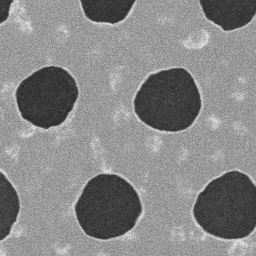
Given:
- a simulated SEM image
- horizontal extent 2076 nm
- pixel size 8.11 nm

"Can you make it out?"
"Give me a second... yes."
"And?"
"holes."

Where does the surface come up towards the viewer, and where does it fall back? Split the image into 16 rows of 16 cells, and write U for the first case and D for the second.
DUUUUDDDUUUUUDDD
UUUUUUUUUUUUUDDU
UUUUUUUUUUUUUUUU
UUUUUUUUUUUUUUUU
UUDDUUUUUUDDUUUU
UDDDDUUUUDDDUUUU
UDDDDUUUDDDDDUUU
UUDDUUUUUDDDUUUU
UUUUUUUUUUUUUUUU
UUUUUUUUUUUUUUUU
UUUUUUUUUUUUUUUU
DUUUUDDDUUUUUDDD
DUUUUDDDDUUUDDDD
DUUUUDDDDUUUDDDD
DUUUUDDDUUUUUDDD
UUUUUUUUUUUUUUUU